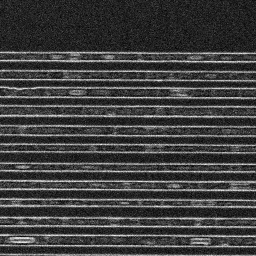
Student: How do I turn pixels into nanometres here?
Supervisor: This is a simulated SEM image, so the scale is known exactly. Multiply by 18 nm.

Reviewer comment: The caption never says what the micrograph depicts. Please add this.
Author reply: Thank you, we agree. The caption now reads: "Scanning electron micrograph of parallel lines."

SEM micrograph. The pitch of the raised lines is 330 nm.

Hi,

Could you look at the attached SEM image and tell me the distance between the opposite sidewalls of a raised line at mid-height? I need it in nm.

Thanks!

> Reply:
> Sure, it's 193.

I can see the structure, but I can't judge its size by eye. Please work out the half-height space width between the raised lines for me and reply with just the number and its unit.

0.135 microns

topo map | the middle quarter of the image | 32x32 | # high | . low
################################
################################
................................
................................
################################
################################
................................
................................
#############.......##..###.....
################################
.###############################
................................
................................
################################
################################
################################
................................
................................
################################
################################
................................
................................
################################
################################
################################
................................
................................
################################
################################
................................
................................
########################........